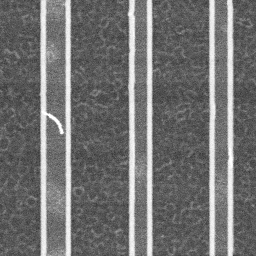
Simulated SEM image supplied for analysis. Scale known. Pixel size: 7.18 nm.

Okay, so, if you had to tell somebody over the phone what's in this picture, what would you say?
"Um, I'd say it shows one or a few lines or trenches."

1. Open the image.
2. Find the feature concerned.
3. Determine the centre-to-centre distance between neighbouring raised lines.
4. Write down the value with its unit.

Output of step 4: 594 nm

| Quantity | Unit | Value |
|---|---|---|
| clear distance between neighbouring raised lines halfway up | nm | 451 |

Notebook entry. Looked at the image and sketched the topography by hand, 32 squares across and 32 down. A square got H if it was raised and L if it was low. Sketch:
LLLLLHHHLLLLLLLLHHHLLLLLLLLHHLLL
LLLLLHHHLLLLLLLLHHHLLLLLLLLHHLLL
LLLLLHHHLLLLLLLLHHHLLLLLLLLHHLLL
LLLLLHHHLLLLLLLLHHHLLLLLLLLHHLLL
LLLLLHHHLLLLLLLLLHHLLLLLLLLHHLLL
LLLLLHHHLLLLLLLLHHHLLLLLLLLHHLLL
LLLLLHHHLLLLLLLLHHHLLLLLLLLHHLLL
LLLLLHHHLLLLLLLLHHHLLLLLLLLHHLLL
LLLLLHHHLLLLLLLLHHHLLLLLLLLHHLLL
LLLLLHHHLLLLLLLLHHHLLLLLLLLHHLLL
LLLLLHHHLLLLLLLLHHHLLLLLLLLHHLLL
LLLLLHHHLLLLLLLLHHHLLLLLLLLHHLLL
LLLLLHHHLLLLLLLLHHHLLLLLLLLHHLLL
LLLLLHHHLLLLLLLLHHHLLLLLLLLHHLLL
LLLLLHHHLLLLLLLLHHHLLLLLLLLHHLLL
LLLLLHHHLLLLLLLLHHHLLLLLLLLHHLLL
LLLLLHHHLLLLLLLLHHHLLLLLLLLHHLLL
LLLLLHHHHLLLLLLLLHHLLLLLLLLHHLLL
LLLLLHHHHLLLLLLLLHHLLLLLLLLHHLLL
LLLLLHHHHLLLLLLLLHHLLLLLLLLHHLLL
LLLLLHHHHLLLLLLLHHHLLLLLLLLHHLLL
LLLLLHHHHLLLLLLLHHHLLLLLLLLHHLLL
LLLLLHHHHLLLLLLLHHHLLLLLLLLHHLLL
LLLLLHHHHLLLLLLLHHHLLLLLLLLHHLLL
LLLLLHHHHLLLLLLLHHHLLLLLLLLHHLLL
LLLLLHHHHLLLLLLLHHHLLLLLLLLHHLLL
LLLLLHHHHLLLLLLLHHHLLLLLLLLHHLLL
LLLLLHHHHLLLLLLLHHHLLLLLLLLHHLLL
LLLLLHHHHLLLLLLLHHHLLLLLLLLHHLLL
LLLLLHHHHLLLLLLLHHHLLLLLLLLHHLLL
LLLLLHHHHLLLLLLLHHHLLLLLLLLHHLLL
LLLLLHHHHLLLLLLLHHHLLLLLLLLHHLLL